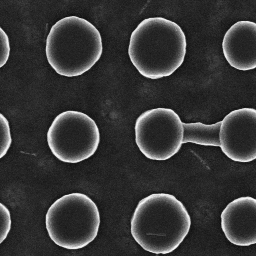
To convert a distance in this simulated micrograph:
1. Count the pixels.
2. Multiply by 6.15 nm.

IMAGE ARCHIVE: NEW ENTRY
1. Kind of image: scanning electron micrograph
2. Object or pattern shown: raised bodies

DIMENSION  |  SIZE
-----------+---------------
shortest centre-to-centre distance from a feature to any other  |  518 nm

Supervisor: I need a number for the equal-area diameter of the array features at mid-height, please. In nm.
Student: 354